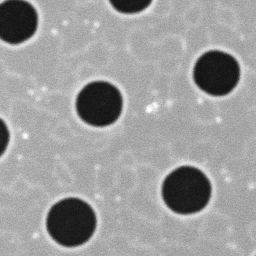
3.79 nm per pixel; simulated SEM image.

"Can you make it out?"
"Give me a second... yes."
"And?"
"holes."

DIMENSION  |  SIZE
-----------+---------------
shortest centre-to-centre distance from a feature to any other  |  455 nm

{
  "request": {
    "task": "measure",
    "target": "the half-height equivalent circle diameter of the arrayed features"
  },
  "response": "48.9 pixels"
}